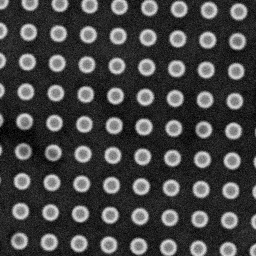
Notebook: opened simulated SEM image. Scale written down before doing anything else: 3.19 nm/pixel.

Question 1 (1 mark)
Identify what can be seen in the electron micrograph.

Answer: an array of small figures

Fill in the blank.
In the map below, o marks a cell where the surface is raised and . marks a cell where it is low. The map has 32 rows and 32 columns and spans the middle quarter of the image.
....oooo...oooo....oooo...oooo..
....ooo....oooo....oooo...oooo..
...................ooo.....ooo..
................................
................................
................................
....ooo....ooo.....oo...........
....ooo....oooo...oooo....oooo..
....ooo....oooo...oooo....oooo..
.....o......oo.....ooo....oooo..
...........................oo...
................................
................................
....oo......o...................
...oooo....ooo....oooo....ooo...
...oooo....ooo....oooo....ooo...
....ooo....ooo....oooo....ooo...
...................oo.....ooo...
................................
................................
................................
...oooo....ooo.....oo...........
...oooo...oooo....oooo...oooo...
...oooo...oooo....oooo...oooo...
....o......oo.....ooo....oooo...
...........................o....
................................
................................
...ooo.....oo...................
..oooo....oooo....ooo.....oo....
..oooo....oooo...oooo....oooo...
...ooo....oooo...oooo....oooo...